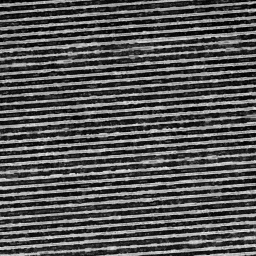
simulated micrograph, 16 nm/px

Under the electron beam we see parallel lines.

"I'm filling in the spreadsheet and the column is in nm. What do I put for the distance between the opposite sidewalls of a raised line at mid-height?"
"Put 43.9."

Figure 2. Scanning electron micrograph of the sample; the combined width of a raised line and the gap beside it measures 121 nanometers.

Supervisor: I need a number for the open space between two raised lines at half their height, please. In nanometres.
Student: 73.8